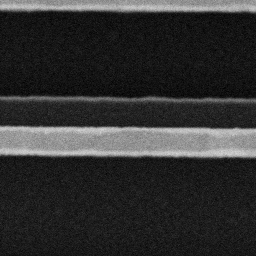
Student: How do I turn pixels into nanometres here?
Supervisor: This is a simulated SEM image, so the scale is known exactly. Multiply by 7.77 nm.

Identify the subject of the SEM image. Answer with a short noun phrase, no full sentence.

lines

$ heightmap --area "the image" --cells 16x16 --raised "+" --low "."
++++++++++++++++
................
................
................
................
................
++++++++++++++++
++++++++++++++++
++++++++++++++++
++++++++++++++++
................
................
................
................
................
................